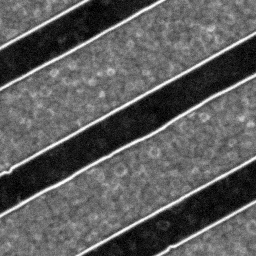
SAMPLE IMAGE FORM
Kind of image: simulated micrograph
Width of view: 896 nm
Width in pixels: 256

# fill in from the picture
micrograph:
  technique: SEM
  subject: one or a few lines or trenches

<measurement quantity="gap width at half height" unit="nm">254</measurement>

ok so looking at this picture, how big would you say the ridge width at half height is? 130 nanometers